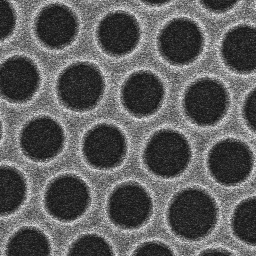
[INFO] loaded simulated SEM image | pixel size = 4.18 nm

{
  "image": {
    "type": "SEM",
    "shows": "a regular array of holes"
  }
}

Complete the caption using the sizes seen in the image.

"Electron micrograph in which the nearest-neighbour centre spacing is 263 nm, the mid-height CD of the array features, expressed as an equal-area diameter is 188 nm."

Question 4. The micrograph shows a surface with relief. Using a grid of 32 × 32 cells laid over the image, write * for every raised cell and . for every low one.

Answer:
.******.**********..*****....***
..***....*****.************.****
..***.....***....*****..********
..**......**.....***.....****...
.****....***.....***.....***....
*****....***.....***.....***....
*************...****.....***....
*...*****************...****....
.....***....*****************...
.....**......***...*************
.....**......**.....****....****
....***......**.....***.....***.
*..****.....***.....***......**.
********...*****....***.....**..
*****************.*****.....**..
***....*****************...****.
***.....***....*****..**********
**......**......***....*****.***
***.....**......**......***....*
***....***.....***......**......
***********....***.....***......
..*****************....***.....*
...****...*****************...**
...***.....****...******.*******
...***.....***.....***....******
...***.....***.....**......***..
..****....***......**......**...
********.*****....***......**...
***.************.****......**...
**....****..**********....****..
*.....***....*****..***********.
*.....***.....***....****...****